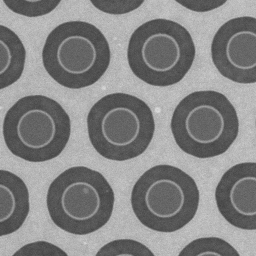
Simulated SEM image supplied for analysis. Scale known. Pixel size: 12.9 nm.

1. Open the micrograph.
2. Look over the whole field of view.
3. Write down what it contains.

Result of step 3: an array of small figures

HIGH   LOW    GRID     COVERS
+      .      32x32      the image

+......+++++......++++......++++
++....+++++++...++++++++..++++++
+++++++++++++++++++..++++++++...
.++++++.....+++++......++++.....
..++++.......+++...++...+++..+++
...+++..+++...++..++++..++...+++
+..++..+++++..++..++++..++..++++
+..++..+++++..++..++++..+++..+++
+..+++..+++..+++...++...+++.....
...+++.......++++......+++++....
..+++++.....+++++++...++++++++++
++++++++++++++++++++++++...+++++
++.....+++++......+++++......+++
+.......+++........+++...+...+++
+..+++...++..++++..+++..++++..++
..+++++..++..++++..++..+++++..++
..+++++..++..++++..++...++++..++
+..+++...++...++...+++...++..+++
+.......++++......++++.......+++
++.....++++++....+++++++...+++++
++++++++++++++++++++++++++++++..
.+++++++....++++++.....+++++....
...++++......++++.......+++...++
+..+++...+++..+++..+++...++..+++
++..++..++++..++..+++++..++..+++
++..++..++++..++..+++++..++..+++
+...++..++++..+++..+++...++...++
...++++.......+++.......++++....
..++++++.....++++++....+++++++..
++++++++++++++++++++++++++++++++
+++....++++++.....++++++.....+++
++......++++.......+++........++